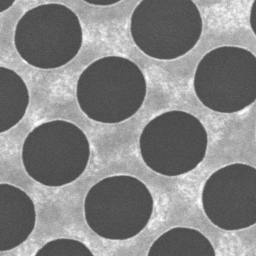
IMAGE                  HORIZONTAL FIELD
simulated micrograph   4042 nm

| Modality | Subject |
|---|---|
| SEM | holes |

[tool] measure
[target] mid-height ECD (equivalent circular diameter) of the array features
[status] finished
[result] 1070 nm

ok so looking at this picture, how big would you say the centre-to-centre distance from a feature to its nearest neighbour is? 1300 nm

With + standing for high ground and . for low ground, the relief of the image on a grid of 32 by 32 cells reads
..++++..+++...+++.......++++++++
+++......++++++++........++++++.
++........++++++.........++++++.
++........++++++.........++++++.
++........++++++.........+++++++
++........+++++++........+++++++
++........++++++++......++.....+
+++......+++....+++++++++.......
.++++..++++......++++++++.......
..++++++++........++++++........
...+++++++........++++++........
....++++++........++++++........
....++++++........+++++++.......
...+++++++........++++++++.....+
...++++++++......+++....++++++++
..+++....+++++++++.......+++++++
.+++......++++++++........++++++
+++........++++++.........++++++
+++........++++++.........++++++
+++........+++++++........++++++
+++........+++++++.......++++..+
+++.......+++++++++.....+++.....
++++.....++++....+++++++++......
..+++++++++.......+++++++.......
....+++++++........++++++.......
....+++++++........++++++.......
....+++++++........+++++++......
....+++++++........+++++++......
....+++++++.......++++..+++....+
....++++++++.....+++......++++++
...+++....+++++++++.......++++++
+++++......++++++++........+++++